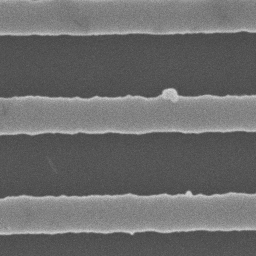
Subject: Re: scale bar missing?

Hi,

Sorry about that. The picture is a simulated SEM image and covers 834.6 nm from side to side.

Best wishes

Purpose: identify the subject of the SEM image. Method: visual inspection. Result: lines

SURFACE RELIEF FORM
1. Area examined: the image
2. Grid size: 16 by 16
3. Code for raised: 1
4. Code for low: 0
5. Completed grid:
1111111111111111
1111111111111111
0000000000000000
0000000000000000
0000000000000000
0000000000000000
1111111111111111
1111111111111111
0000000000000000
0000000000000000
0000000000000000
0000000000000000
1111111111111111
1111111111111111
1111111110100000
0000000000000000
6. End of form